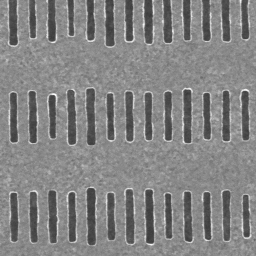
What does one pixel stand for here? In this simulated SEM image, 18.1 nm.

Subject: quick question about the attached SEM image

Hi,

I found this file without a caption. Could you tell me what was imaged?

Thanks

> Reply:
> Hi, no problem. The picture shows a regular array of holes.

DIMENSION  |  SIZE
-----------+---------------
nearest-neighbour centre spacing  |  348 nanometres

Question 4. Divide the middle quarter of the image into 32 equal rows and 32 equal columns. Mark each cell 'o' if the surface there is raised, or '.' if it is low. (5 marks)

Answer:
oooooooooooooooooooooooooooooooo
oooooooooooooooooooooooooooooooo
oooooooooooooooooooooooooooooooo
oooooooooooooooooooooooooooooooo
oooooooooooooooooooooooooooooooo
oooooooooooooooooooooooooooooooo
o.oooo..oooooooooooooooooooooo..
o..oo...ooo.ooo..ooo..ooo..ooo..
o..oo...ooo..oo..ooo..ooo..ooo..
o..oo...oo...oo..ooo..ooo..ooo..
o..oo...oo...oo..ooo..ooo..ooo..
o..oo...ooo..oo..ooo..ooo..ooo..
o..ooo..ooo..oo..ooo..ooo..ooo..
o..ooo..ooo..oo..ooo..ooo..ooo..
o..ooo..ooo..oo...oo..ooo..ooo..
o..ooo..ooo..oo...oo..ooo..ooo..
o..ooo..ooo..oo...oo..ooo..ooo..
o..ooo..ooo..oo...oo..ooo..ooo..
o..ooo..ooo..oo..ooo..ooo..ooo..
o..ooo..oooooooooooooooooooooo..
oooooooooooooooooooooooooooooooo
oooooooooooooooooooooooooooooooo
oooooooooooooooooooooooooooooooo
oooooooooooooooooooooooooooooooo
oooooooooooooooooooooooooooooooo
oooooooooooooooooooooooooooooooo
oooooooooooooooooooooooooooooooo
oooooooooooooooooooooooooooooooo
oooooooooooooooooooooooooooooooo
oooooooooooooooooooooooooooooooo
oooooooooooooooooooooooooooooooo
oooooo..oooooooo.ooo..oooooooooo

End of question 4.